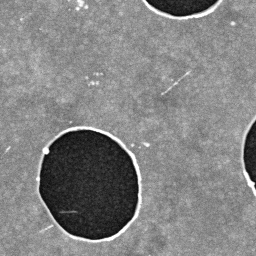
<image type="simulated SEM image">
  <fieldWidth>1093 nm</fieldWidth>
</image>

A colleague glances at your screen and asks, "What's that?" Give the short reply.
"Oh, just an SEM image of holes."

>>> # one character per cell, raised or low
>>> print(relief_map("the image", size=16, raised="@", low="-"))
@@@@@@@@@@---@@@
@@@@@@@@@@@@@@@@
@@@@@@@@@@@@@@@@
@@@@@@@@@@@@@@@@
@@@@@@@@@@@@@@@@
@@@@@@@@@@@@@@@@
@@@@@@@@@@@@@@@@
@@@@@@@@@@@@@@@@
@@@@---@@@@@@@@-
@@@-----@@@@@@@-
@@@-----@@@@@@@-
@@-------@@@@@@@
@@@------@@@@@@@
@@@-----@@@@@@@@
@@@@---@@@@@@@@@
@@@@@@@@@@@@@@@@